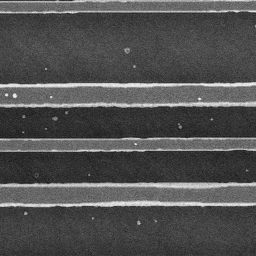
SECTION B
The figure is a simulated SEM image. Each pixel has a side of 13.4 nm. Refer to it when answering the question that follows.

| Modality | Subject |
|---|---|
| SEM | lines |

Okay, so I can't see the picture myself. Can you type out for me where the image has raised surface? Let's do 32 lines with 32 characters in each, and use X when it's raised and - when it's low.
XXXXXXXXXXXXXXXXXXXXXXXXXXXXXXXX
XXXXXXXXXX----------------------
--------------------------------
--------------------------------
--------------------------------
--------------------------------
--------------------------------
--------------------------------
--------------------------------
--------------------------------
--------------------------------
XXXXXXXXXXXXXXXXXXXXXXXXXXXXXXXX
XXXXXXXXXXXXXXXXXXXXXXXXXXXXXXXX
--------------------------------
--------------------------------
--------------------------------
--------------------------------
XXXXXXXXXXXXXXXXXXXXXXXXXXXXXXXX
XXXXXXXXXXXXXXXXXXXXXXXXXXXXXXXX
--------------------------------
--------------------------------
--------------------------------
--------------------------------
XXXXXXXXXXXXXXXXXXXXXXXXXXXXXXXX
XXXXXXXXXXXXXXXXXXXXXXXXXXXXXXXX
XXXXXXXXXXXXXXXXX---XXXXXXXXXXXX
--------------------------------
--------------------------------
--------------------------------
--------------------------------
--------------------------------
--------------------------------